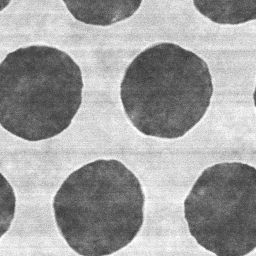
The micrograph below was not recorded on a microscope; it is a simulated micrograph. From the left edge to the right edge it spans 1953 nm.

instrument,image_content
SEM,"holes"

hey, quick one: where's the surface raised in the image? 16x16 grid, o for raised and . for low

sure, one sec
oooo.....ooo....
ooooo..ooooooo.o
oooooooooooooooo
....ooooo...oooo
.....ooo.....ooo
.....ooo.....ooo
.....ooo.....ooo
.....ooo.....ooo
o..ooooooo.ooooo
oooooooooooooooo
ooooo...ooooo...
.ooo.....ooo....
.oo......ooo....
.oo......ooo....
oooo.....ooo....
oooo....ooooo...